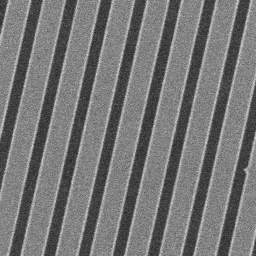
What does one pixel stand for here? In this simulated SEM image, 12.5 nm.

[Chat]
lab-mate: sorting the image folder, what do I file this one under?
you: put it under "parallel lines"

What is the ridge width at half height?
0.267 micrometres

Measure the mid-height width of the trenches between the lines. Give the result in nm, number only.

160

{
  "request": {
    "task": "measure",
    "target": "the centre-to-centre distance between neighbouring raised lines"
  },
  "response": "422 nm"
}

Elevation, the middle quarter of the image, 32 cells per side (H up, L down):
HHHHHLLLLHHHHHLLLHHHHHLLLLHHHHHL
HHHHHLLLHHHHHHLLLHHHHHLLLLHHHHHL
HHHHHLLLHHHHHHLLLHHHHHLLLHHHHHHL
HHHHHLLLHHHHHLLLHHHHHHLLLHHHHHHL
HHHHLLLLHHHHHLLLHHHHHHLLLHHHHHLL
HHHHLLLHHHHHHLLLHHHHHLLLLHHHHHLL
HHHHLLLHHHHHHLLLHHHHHLLLLHHHHHLL
HHHHLLLHHHHHLLLLHHHHHLLLHHHHHHLL
HHHLLLLHHHHHLLLLHHHHHLLLHHHHHLLL
HHHLLLLHHHHHLLLHHHHHLLLLHHHHHLLL
HHHLLLHHHHHHLLLHHHHHLLLLHHHHHLLL
HHHLLLHHHHHHLLLHHHHHLLLHHHHHHLLL
HHHLLLHHHHHLLLHHHHHHLLLHHHHHHLLL
HHLLLLHHHHHLLLHHHHHHLLLHHHHHLLLL
HHLLLHHHHHHLLLHHHHHLLLLHHHHHLLLH
HHLLLHHHHHHLLLHHHHHLLLHHHHHHLLLH
HHLLLHHHHHLLLLHHHHHLLLHHHHHHLLLH
HLLLLHHHHHLLLHHHHHHLLLHHHHHLLLLH
HLLLLHHHHHLLLHHHHHLLLLHHHHHLLLLH
HLLLHHHHHHLLLHHHHHLLLLHHHHHLLLHH
HLLLHHHHHLLLLHHHHHLLLHHHHHHLLLHH
HLLLHHHHHLLLHHHHHHLLLHHHHHHLLLHH
LLLLHHHHHLLLHHHHHHLLLHHHHHLLLLHH
LLLHHHHHHLLLHHHHHLLLLHHHHHLLLHHH
LLLHHHHHHLLLHHHHHLLLHHHHHHLLLHHH
LLLHHHHHLLLLHHHHHLLLHHHHHHLLLHHH
LLLHHHHHLLLHHHHHHLLLHHHHHLLLLHHH
LLLHHHHHLLLHHHHHLLLLHHHHHLLLLHHH
LLHHHHHHLLLHHHHHLLLLHHHHHLLLHHHH
LLHHHHHLLLLHHHHHLLLHHHHHHLLLHHHH
LLHHHHHLLLHHHHHHLLLHHHHHHLLLHHHH
LLHHHHHLLLHHHHHHLLLHHHHHLLLLHHHH